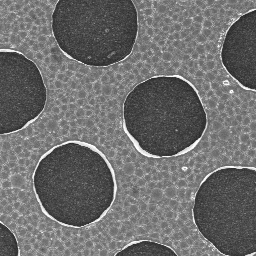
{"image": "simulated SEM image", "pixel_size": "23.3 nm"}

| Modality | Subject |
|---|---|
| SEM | holes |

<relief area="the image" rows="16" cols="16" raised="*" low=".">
***.....********
***......******.
****....******..
.***....******..
..************..
...*****....***.
...*****.....***
..******.....***
********.....***
***...***..*****
**.....*******..
**.....******...
**.....*****....
***...******....
.************...
.*******...***..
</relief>